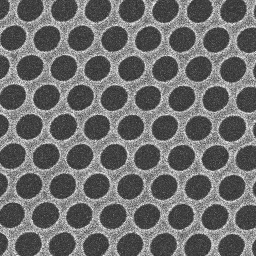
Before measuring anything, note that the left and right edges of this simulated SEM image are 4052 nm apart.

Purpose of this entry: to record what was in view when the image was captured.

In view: a regular array of holes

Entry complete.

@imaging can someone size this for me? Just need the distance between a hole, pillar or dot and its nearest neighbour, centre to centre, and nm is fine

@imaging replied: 533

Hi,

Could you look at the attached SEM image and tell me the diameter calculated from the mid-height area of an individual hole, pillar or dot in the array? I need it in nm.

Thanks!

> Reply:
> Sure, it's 413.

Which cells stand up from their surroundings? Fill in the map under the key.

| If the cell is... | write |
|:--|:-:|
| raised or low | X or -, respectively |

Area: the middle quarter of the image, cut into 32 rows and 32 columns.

---XX-------XX------XX-------XX-
---XX-------X-------XX-------X--
---XX------XXX------XX------XX--
--XXXX----XXXX-----XXXX----XXXX-
XXXXXXXXXXXXXXXXXXXXXXXXXXXXXXXX
XXX---XXXXXX--XXXXXXX-XXXXXXX--X
X------XXX-----XXXX-----XXX-----
X------XX-------XX------XX------
X------XX-------XX------XX------
X------XX-------XX------XX------
X-----XXXX-----XXX-----XXX------
XX---XXXXXX---XXXXXX--XXXXX----X
-XXXXXXXXXXXXXXXXXXXXXXXXXXXXXXX
---XXX-----XXXX----XXXX-----XXXX
---XX------XXX------XX------XXX-
---XX-------XX------XX-------X--
---XX------XX-------XX------XX--
--XXX------XXX-----XXX------XX--
-XXXXX----XXXX-----XXXX----XXXX-
XXXXXXXXXXXXXXXXXXXXXXXXXXXXXXXX
XX----XXXXX----XXXX----XXXXX---X
X------XXX-----XXX------XXX-----
X-------X-------XX------XX------
X------XX-------X-------XX------
X------XX-------XX------XX------
X-----XXXX-----XXX-----XXX------
XXXXXXXXXXX--XXXXXXX-XXXXXXX--XX
-XXXXXXX--XXXXXX--XXXXXXXXXXXXXX
--XXXX-----XXXX----XXXX-----XXXX
---XX------XXX------XX------XXX-
---XX-------X-------XX-------X--
---XX------XX-------XX------XX--